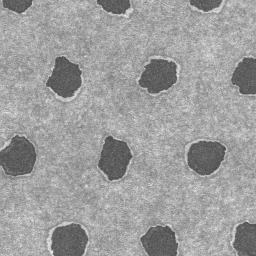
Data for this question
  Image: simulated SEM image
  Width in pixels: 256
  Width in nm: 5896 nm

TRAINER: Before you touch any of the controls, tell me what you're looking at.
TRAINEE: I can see holes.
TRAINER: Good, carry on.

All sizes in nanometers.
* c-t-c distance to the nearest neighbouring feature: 2120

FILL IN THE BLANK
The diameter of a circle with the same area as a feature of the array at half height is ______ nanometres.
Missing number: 854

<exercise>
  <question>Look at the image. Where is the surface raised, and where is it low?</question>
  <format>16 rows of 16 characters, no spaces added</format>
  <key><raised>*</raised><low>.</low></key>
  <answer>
..****..****..**
****************
****************
****************
***..****..****.
***..****..****.
****************
****************
****************
..****..****..**
..****..****..**
****************
****************
****************
***..****..****.
***..****..****.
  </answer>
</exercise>